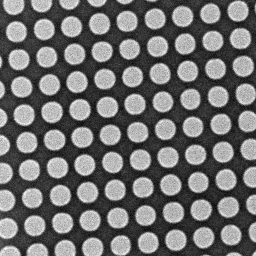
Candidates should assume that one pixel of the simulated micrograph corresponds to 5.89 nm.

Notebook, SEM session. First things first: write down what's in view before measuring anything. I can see an array of small figures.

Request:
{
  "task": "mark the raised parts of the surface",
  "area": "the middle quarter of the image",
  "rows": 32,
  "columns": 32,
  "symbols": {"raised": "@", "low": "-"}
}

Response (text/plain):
----------------------@@@@---@@@
---------@@----@@@@---@@@@---@@@
--@@@---@@@@---@@@@---@@@@---@@@
-@@@@---@@@@@--@@@@---@@@@---@@@
-@@@@@--@@@@@--@@@@----@@@------
-@@@@@--@@@@----@@--------------
--@@@--------------------------@
-----------------------@@@----@@
----------@-----@@@@---@@@@--@@@
--@@@@---@@@@--@@@@@--@@@@@--@@@
--@@@@--@@@@@--@@@@@---@@@@---@@
-@@@@@---@@@@---@@@@---@@@------
--@@@@---@@@@-------------------
---@@--------------------------@
------------------------@@@---@@
-----------@----@@@@---@@@@@--@@
---@@@----@@@@--@@@@@--@@@@@--@@
--@@@@@--@@@@@--@@@@@--@@@@@---@
--@@@@@--@@@@@--@@@@----@@@-----
--@@@@@---@@@-------------------
----@@--------------------------
------------------------@@@@---@
-----------@@----@@@@---@@@@---@
---@@@@---@@@@---@@@@---@@@@---@
---@@@@@--@@@@---@@@@---@@@@---@
@--@@@@@--@@@@---@@@@----@@-----
@--@@@@----@@@------------------
----@@--------------------------
-------------------@-----@@@----
------------@@----@@@@--@@@@@--@
----@@@@---@@@@--@@@@@--@@@@@--@
@--@@@@@--@@@@@--@@@@@---@@@@---